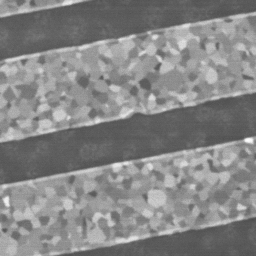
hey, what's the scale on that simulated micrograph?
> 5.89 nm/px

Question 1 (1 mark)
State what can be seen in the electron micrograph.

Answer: one or a few lines or trenches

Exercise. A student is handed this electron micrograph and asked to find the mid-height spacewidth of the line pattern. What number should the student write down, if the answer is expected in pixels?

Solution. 45.3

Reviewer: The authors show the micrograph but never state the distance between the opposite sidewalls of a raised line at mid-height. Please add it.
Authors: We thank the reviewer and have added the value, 0.453 microns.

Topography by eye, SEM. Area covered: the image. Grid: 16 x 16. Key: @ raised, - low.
@@@-------------
------------@@@@
-------@@@@@@@@@
--@@@@@@@@@@@@@@
@@@@@@@@@@@@@@@@
@@@@@@@@@@@@@@@@
@@@@@@@@@@@@----
@@@@@@@---------
@@--------------
------------@@@@
------@@@@@@@@@@
-@@@@@@@@@@@@@@@
@@@@@@@@@@@@@@@@
@@@@@@@@@@@@@@@@
@@@@@@@@@@------
@@@@@-----------